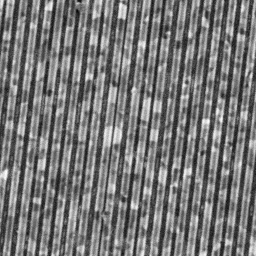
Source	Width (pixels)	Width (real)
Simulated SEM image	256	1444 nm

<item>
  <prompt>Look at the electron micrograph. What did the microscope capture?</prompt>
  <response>parallel lines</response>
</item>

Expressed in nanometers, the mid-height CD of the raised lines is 35.7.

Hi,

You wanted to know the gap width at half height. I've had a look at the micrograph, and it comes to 35.7 nm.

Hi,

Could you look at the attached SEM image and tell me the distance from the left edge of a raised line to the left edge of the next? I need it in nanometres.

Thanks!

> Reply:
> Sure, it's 68.9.